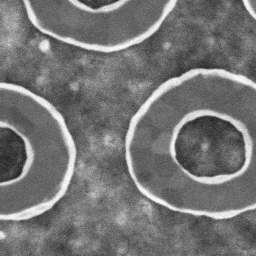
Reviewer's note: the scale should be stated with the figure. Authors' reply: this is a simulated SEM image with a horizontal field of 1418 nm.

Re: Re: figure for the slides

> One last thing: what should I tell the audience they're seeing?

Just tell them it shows ring-shaped raised bodies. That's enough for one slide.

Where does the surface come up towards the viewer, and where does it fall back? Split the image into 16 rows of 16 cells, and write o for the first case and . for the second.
..ooo..oooo.....
..oooooooo......
....ooooo.......
................
............oo..
o.........oooooo
ooo......ooooooo
oooo....oooo..oo
.ooo....ooo....o
..ooo...ooo.....
..oo....ooo....o
oooo.....ooooooo
ooo.......oooooo
o............o..
................
................